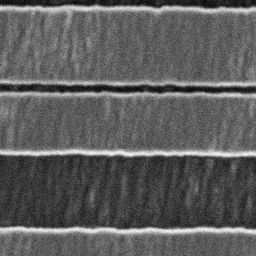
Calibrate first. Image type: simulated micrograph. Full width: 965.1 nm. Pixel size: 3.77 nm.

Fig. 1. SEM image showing lines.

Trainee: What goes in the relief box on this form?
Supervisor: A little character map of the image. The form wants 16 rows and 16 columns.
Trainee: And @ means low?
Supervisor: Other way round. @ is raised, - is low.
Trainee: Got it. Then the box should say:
@@@@@@@@@-@@----
@@@@@@@@@@@@@@@@
@@@@@@@@@@@@@@@@
@@@@@@@@@@@@@@@@
@@@@@@@@@@@@@@@@
@@@@@@@@@@@@@@@@
@@@@@@@@@@@@@@@@
@@@@@@@@@@@@@@@@
@@@@@@@@@@@@@@@@
@@@@@@@@@@@@@@@@
----------------
----------------
----------------
----------------
@@@@@@@@@@@@@@@@
@@@@@@@@@@@@@@@@